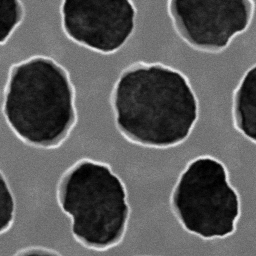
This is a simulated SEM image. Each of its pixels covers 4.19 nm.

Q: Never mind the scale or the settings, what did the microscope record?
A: holes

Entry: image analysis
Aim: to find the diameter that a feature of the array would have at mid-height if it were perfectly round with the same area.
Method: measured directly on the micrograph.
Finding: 304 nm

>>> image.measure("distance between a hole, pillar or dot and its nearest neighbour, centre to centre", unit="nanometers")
457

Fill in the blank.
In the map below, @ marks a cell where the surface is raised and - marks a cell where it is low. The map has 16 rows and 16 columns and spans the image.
-@@@----@@@-----
-@@@----@@@----@
@@@@@---@@@@--@@
@@@@@@@@@@@@@@@@
@---@@@@---@@@@@
@---@@@-----@@@-
----@@@-----@@@-
@---@@@-----@@@-
@@--@@@@----@@@@
@@@@@@@@@@@@@@@@
@@@@@-@@@@@@--@@
@@@@----@@@---@@
-@@@----@@@----@
-@@@----@@@----@
@@@@@---@@@@--@@
@@@@@@@@@@@@@@@@